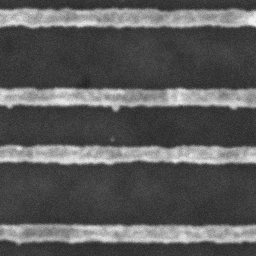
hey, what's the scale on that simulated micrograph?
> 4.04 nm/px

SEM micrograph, lines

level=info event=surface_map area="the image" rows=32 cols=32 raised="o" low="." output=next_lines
................................
oooooooooooooooooooooooooooooooo
oooooooooooooooooooooooooooooooo
................................
................................
................................
................................
................................
................................
................................
................................
oooooooooooooooooooooooooooooooo
oooooooooooooooooooooooooooooooo
................................
................................
................................
................................
................................
oooooooooooooooooooo..oooooo.ooo
oooooooooooooooooooooooooooooooo
................................
................................
................................
................................
................................
................................
................................
................................
oooooooooooooooooooooooooooooooo
oooooooooooooooooooooooooooooooo
................................
................................